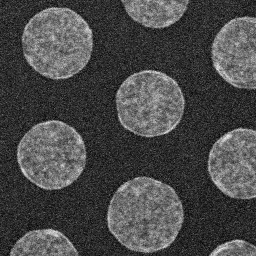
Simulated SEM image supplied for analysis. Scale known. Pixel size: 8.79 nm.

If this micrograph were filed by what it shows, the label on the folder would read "raised bodies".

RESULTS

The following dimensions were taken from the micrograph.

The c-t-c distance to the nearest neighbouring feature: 969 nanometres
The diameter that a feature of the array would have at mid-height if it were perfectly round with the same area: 68.5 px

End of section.